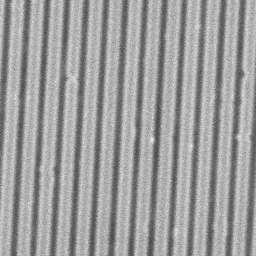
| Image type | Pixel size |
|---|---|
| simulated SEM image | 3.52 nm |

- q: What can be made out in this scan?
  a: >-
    parallel lines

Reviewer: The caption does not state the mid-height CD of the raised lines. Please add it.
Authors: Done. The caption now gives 0.0413 micrometres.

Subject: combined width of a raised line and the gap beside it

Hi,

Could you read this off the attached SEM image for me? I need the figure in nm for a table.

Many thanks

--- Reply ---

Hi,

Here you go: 68.7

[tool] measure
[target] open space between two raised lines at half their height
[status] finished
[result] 0.0285 microns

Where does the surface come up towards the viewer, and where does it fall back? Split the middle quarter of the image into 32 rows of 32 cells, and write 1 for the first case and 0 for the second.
01110011100110001100111001110011
01110011000110011100111001110011
01100011000110011100111001110011
01100011000110011100111001110011
01100011000110011100111001110011
01100011001110011100111001110011
01100111001110011100111001110011
01100111001110011100111001110011
01100111001110011100111001110011
01100111001110011100111001110011
11100111001110011100111001110011
11100111001110011100111001100011
11100111001110011100111001100111
11100111001110011000110011100111
11100111001100011000110011100111
11100111001100011000110011100111
11100111001100011100110011100111
11100111001100011000110011100111
11100111001100111001110011100111
11000110001100111001110011100111
11000110001100111001110011100111
11000110001100111001110011100111
11000110001100111001110011100111
11001110011100111001110011100111
11001110011100111001110011100111
11001110011100111001110011100110
11001110011100111001110011100110
11001110011100111001110011100110
11001110011100111001110011100110
11001110011100111001110011100110
11001110011100111001100011001110
11001110011100110001100111001110